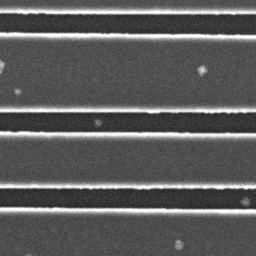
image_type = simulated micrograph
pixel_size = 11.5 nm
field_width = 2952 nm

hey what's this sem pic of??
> lines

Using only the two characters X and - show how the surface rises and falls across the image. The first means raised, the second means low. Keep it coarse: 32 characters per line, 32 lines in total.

XXXXXXXXXXXXXXXXXXXXXXXXXXXXXXXX
XXXXXXXXXXXXXXXXXXXXXXXXXXXXXXXX
--------------------------------
--------------------------------
XXXXXXXXXXXXXXXXXXXXXX-XX-------
XXXXXXXXXXXXXXXXXXXXXXXXXXXXXXXX
XXXXXXXXXXXXXXXXXXXXXXXXXXXXXXXX
XXXXXXXXXXXXXXXXXXXXXXXXXXXXXXXX
XXXXXXXXXXXXXXXXXXXXXXXXXXXXXXXX
XXXXXXXXXXXXXXXXXXXXXXXXXXXXXXXX
XXXXXXXXXXXXXXXXXXXXXXXXXXXXXXXX
XXXXXXXXXXXXXXXXXXXXXXXXXXXXXXXX
XXXXXXXXXXXXXXXXXXXXXXXXXXXXXXXX
XXXXXXXXXXXXXXXXXXXXXXXXXXXXXXXX
--------------------------------
--------------------------------
--------------------------------
XXXXXXXXXXXXXXXXXXXXXXXXXXXXXXXX
XXXXXXXXXXXXXXXXXXXXXXXXXXXXXXXX
XXXXXXXXXXXXXXXXXXXXXXXXXXXXXXXX
XXXXXXXXXXXXXXXXXXXXXXXXXXXXXXXX
XXXXXXXXXXXXXXXXXXXXXXXXXXXXXXXX
XXXXXXXXXXXXXXXXXXXXXXXXXXXXXXXX
-----------------XX--------X--XX
--------------------------------
--------------------------------
XXXXXXXXXXXXXXXXXXXXXXXXXXXXXXXX
XXXXXXXXXXXXXXXXXXXXXXXXXXXXXXXX
XXXXXXXXXXXXXXXXXXXXXXXXXXXXXXXX
XXXXXXXXXXXXXXXXXXXXXXXXXXXXXXXX
XXXXXXXXXXXXXXXXXXXXXXXXXXXXXXXX
XXXXXXXXXXXXXXXXXXXXXXXXXXXXXXXX